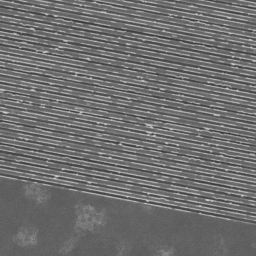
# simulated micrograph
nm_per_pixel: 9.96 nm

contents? parallel lines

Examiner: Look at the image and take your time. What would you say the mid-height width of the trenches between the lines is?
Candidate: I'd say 26.9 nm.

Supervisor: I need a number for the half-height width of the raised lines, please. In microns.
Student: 0.0525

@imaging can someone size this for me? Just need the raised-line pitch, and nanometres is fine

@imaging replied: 74.7